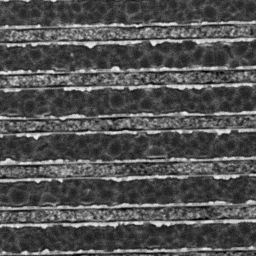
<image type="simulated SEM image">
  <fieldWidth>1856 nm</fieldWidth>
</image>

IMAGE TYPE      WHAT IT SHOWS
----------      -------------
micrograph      parallel lines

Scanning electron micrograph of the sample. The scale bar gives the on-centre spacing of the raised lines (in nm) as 328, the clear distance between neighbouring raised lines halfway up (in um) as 0.105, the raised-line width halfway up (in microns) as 0.223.